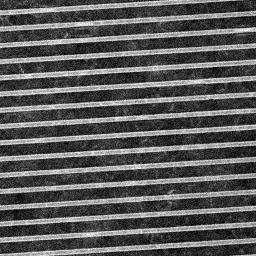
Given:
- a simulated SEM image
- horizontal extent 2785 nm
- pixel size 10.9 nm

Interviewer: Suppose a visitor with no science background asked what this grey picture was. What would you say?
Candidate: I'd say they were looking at parallel lines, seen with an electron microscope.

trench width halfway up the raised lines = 12.2 pixels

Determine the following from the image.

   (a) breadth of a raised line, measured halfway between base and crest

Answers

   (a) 43.4 nm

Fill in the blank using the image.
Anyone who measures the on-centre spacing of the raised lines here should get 176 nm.